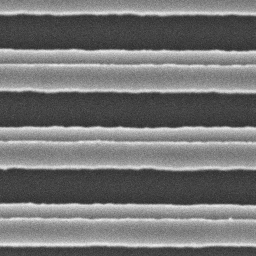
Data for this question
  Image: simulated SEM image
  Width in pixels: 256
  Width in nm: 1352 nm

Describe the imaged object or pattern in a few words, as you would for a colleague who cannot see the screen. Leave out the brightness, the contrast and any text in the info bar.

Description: lines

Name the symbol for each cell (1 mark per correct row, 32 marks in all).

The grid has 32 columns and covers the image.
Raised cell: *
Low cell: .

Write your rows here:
********************************
********************************
................................
................................
................................
................................
****************************.*.*
********************************
********************************
********************************
********************************
................................
................................
................................
................................
................................
********************************
********************************
********************************
********************************
********************************
................................
................................
................................
................................
...*............................
********************************
********************************
********************************
********************************
************...*****************
................................